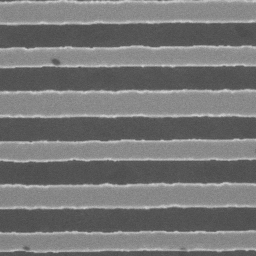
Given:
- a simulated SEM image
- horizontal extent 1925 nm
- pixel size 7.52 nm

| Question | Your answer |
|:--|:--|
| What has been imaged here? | lines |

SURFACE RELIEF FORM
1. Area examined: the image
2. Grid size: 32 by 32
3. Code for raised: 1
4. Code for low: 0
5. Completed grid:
11111111111111111111111111111111
11111111111111111111111111111111
11111111111111111111111111111111
00000000000000000000000000000000
00000000000000000000000000000000
00000000000000000000000000000000
11111111111111111111111111111111
11111111111111111111111111111111
00000000000000000000000000000000
00000000000000000000000000000000
00000000000000000000000000000000
00000111110111111111111111111111
11111111111111111111111111111111
11111111111111111111111111111111
11111111110011100011111000000011
00000000000000000000000000000000
00000000000000000000000000000000
00000000000000000000000000000111
11111111111111111111111111111111
11111111111111111111111111111111
00000000000000000000000000000000
00000000000000000000000000000000
00000000000000000000000000000000
11111111111111111111111111111111
11111111111111111111111111111111
11111111111111111111111111111111
00000000000000000000000000000000
00000000000000000000000000000000
00000000000000000000000000000000
11111111111111111111111111111111
11111111111111111111111111111111
00001110000000000000000000000000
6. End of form